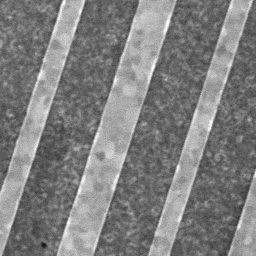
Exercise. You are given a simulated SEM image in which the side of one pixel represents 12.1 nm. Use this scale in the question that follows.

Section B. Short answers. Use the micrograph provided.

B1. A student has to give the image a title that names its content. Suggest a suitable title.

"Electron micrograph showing one or a few lines or trenches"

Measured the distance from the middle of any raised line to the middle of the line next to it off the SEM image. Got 79.7 pixels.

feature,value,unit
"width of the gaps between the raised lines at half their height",642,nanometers